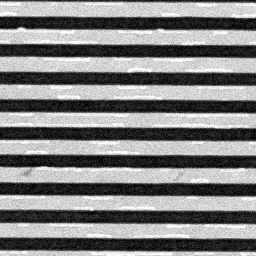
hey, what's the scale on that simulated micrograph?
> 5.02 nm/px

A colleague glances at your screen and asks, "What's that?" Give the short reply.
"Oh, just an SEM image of parallel lines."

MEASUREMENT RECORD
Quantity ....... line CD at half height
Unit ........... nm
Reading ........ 78.5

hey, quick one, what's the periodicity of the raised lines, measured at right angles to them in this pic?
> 139 nm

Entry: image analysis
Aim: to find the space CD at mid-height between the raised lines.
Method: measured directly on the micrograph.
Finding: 60.9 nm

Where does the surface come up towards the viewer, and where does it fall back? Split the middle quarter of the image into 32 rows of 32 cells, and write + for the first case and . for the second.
++++++++++++++++++++++++++++++++
++++++++++++++++++++++++++++++++
................................
................................
................................
++++++++++++++++++++++++++++++++
++++++++++++++++++++++++++++++++
++++++++++++++++++++++++++++++++
++++++++++++++++++++++++++++++++
................................
................................
................................
++++++++++++++++++++++++++++++++
++++++++++++++++++++++++++++++++
++++++++++++++++++++++++++++++++
++++++++++++++++++++++++++++++++
................................
................................
................................
++++++++++++++++++++++++++++++++
++++++++++++++++++++++++++++++++
++++++++++++++++++++++++++++++++
++++++++++++++++++++++++++++++++
................................
................................
................................
++++++++++++++++++++++++++++++++
++++++++++++++++++++++++++++++++
++++++++++++++++++++++++++++++++
++++++++++++++++++++++++++++++++
................................
................................